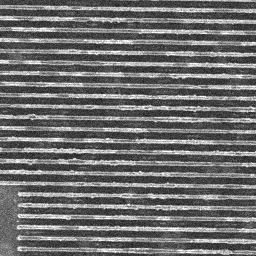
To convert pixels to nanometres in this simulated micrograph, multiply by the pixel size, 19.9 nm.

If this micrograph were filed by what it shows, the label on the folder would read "parallel lines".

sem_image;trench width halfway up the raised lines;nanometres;157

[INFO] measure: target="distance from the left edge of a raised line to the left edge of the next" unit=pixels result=11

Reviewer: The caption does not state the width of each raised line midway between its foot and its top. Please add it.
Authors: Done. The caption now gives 0.0597 microns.